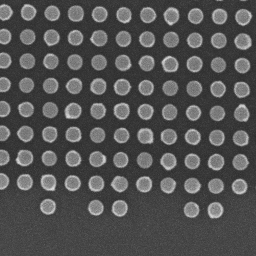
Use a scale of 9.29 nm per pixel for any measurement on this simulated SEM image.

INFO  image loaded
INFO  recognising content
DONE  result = a regular array of raised bodies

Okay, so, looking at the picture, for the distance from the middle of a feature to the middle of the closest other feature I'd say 220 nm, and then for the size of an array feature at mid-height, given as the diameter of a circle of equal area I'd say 0.142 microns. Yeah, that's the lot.